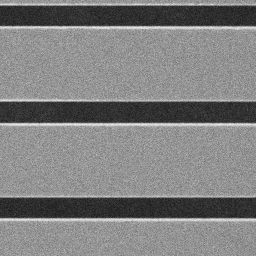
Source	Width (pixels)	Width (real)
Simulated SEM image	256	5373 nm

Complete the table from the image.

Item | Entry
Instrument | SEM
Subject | lines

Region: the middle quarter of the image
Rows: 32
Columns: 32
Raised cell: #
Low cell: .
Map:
################################
################################
################################
################################
################################
################################
################################
################################
################################
................................
................................
................................
................................
................................
................................
################################
################################
################################
################################
################################
################################
################################
################################
################################
################################
################################
################################
################################
################################
################################
################################
################################